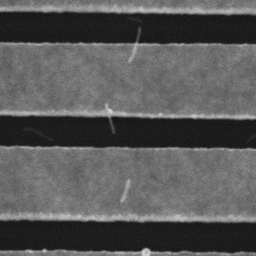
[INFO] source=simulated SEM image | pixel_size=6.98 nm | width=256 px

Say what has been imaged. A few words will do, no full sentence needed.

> lines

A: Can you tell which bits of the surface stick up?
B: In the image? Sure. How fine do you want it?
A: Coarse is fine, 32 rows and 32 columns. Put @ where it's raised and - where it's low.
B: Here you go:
@@@@@@@@@@@@@@@@@@@@@@@@@@@@@@@@
-----@---@-@@@@@@@@@@@@@@@@@@@@@
--------------------------------
--------------------------------
--------------------------------
@@@@@@-@@@@@@----@--------------
@@@@@@@@@@@@@@@@@@@@@@@@@@@@@@@@
@@@@@@@@@@@@@@@@@@@@@@@@@@@@@@@@
@@@@@@@@@@@@@@@@@@@@@@@@@@@@@@@@
@@@@@@@@@@@@@@@@@@@@@@@@@@@@@@@@
@@@@@@@@@@@@@@@@@@@@@@@@@@@@@@@@
@@@@@@@@@@@@@@@@@@@@@@@@@@@@@@@@
@@@@@@@@@@@@@@@@@@@@@@@@@@@@@@@@
@@@@@@@@@@@@@@@@@@@@@@@@@@@@@@@@
-----------@-@@@@@@@@@@@@@@@@@@@
--------------------------------
--------------------------------
--------------------------------
@@@@@@@@@@@@-@@@-----@@---------
@@@@@@@@@@@@@@@@@@@@@@@@@@@@@@@@
@@@@@@@@@@@@@@@@@@@@@@@@@@@@@@@@
@@@@@@@@@@@@@@@@@@@@@@@@@@@@@@@@
@@@@@@@@@@@@@@@@@@@@@@@@@@@@@@@@
@@@@@@@@@@@@@@@@@@@@@@@@@@@@@@@@
@@@@@@@@@@@@@@@@@@@@@@@@@@@@@@@@
@@@@@@@@@@@@@@@@@@@@@@@@@@@@@@@@
@@@@@@@@@@@@@@@@@@@@@@@@@@@@@@@@
------@@@@@@@@@@@@@@@@@@@@@@@@@@
--------------------------------
--------------------------------
--------------------------------
@@@@@@@@@@-@@----@@-------------